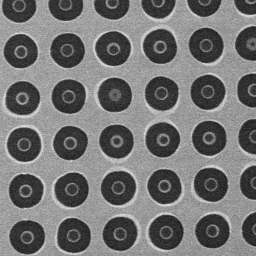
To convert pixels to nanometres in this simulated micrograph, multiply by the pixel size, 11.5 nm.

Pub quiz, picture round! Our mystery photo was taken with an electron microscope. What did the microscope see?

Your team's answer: an array of small figures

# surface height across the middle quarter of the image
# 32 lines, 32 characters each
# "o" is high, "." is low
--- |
...oooooooo..ooooooooooooooooooo
oooooooooooooooooooooooooooooooo
oooooooooooooooooooooooooooooooo
ooooooooooo...oooooooo....oooooo
....ooooo.......ooooo.......oooo
.....ooo........oooo.........ooo
.....ooo.........ooo...oo....oo.
ooo...oo....oo...ooo...ooo...oo.
ooo...oo....o....ooo...oo....ooo
.o...ooo.........ooo........oooo
.....oooo.......ooooo.......oooo
....oooooo.....ooooooo.....ooooo
..oooooooooooooooooooooooooooooo
oooooooooooooooooooooooooooooooo
ooooooooooooooooooooooo...oooooo
...oooooooo....oooooo......ooooo
.....ooooo.......oooo.......oooo
......ooo........ooo.........ooo
.o....ooo...oo...ooo....oo...ooo
ooo...ooo...oo....oo....oo...ooo
ooo...ooo....o...oooo........ooo
.....oooo........oooo.......oooo
.....ooooo.......ooooo.....ooooo
....ooooooo....ooooooooooooooooo
oooooooooooooooooooooooooooooooo
oooooooooooooooooooooooooooooooo
ooooooooooooo..oooooooo....ooooo
....ooooooo......ooooo......oooo
.....ooooo........ooo........ooo
......ooo.........ooo...oo...ooo
.oo...ooo...ooo...oo....oo....oo
.oo...ooo...ooo...ooo...oo....oo